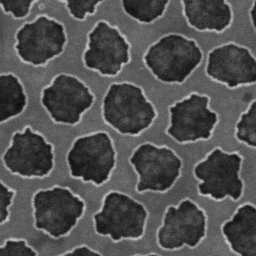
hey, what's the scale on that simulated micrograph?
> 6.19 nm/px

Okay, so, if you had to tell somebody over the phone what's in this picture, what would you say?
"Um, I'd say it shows a regular array of holes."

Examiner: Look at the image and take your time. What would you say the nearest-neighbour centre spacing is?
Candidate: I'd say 385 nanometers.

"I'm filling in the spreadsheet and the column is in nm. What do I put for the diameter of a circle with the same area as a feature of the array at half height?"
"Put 293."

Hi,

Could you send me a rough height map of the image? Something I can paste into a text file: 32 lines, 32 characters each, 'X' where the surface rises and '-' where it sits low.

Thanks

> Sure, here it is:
----XXXX----XXX------XX-----XXXX
X---XXXXX---XXXX----XXX------XX-
XXXX--XXXXXXXXXXX--XXXX------XXX
XXX-----XXXX--XXXXXXXXXX----XXXX
XX------XXX----XXXXXX--XXXXXXXXX
XX------XXX-----XXX-----XXXXXXXX
XX------XXX-----XX-------X-----X
XXX---XXXXX-----XX-------X------
XXXXXXXXXXX----XXXX-----XX------
--XXXXX--XXXXXXXXXX----XXX------
---XXX----XXXX--XXXXXXXXXXXX--XX
---XX------XX-----XXXXXXXXXXXXXX
---XX-------X-----XXXXX---XXXXXX
---XXX-----XX------XX-----XXXXX-
--XXXX----XXX------XX------XXX--
XXXXXXXXXXXXXX-----XX------XXX--
XXX-XXXXXXXXXXX--XXXX-----XXXX--
XX----XXXX----XXXXXXXX--XXXXXX--
X-----XXX-----XXX----XXXXXXXXXXX
X------X------XX------XXXX----XX
X------XX-----XXX------XX-----XX
XX----XXX-----XXX-----XX------XX
XXXXXXXXXX---XXXX-----XXX-----XX
-XXXXXX-XXXXXXXXX----XXXX-----XX
--XX-----XXXX---XXXXXXXXXX----XX
-XXX------XXX-----XXXXX-XXXXXXXX
-XXX------XX------XXX----XXXXX--
-XXX------XX------XXX-----XXX---
XXXXX----XXX------XX------XX----
XXXXXXXXXXXXXX----XX-----XXX----
X--XXXXXXXXXXXXXXXXX-----XXXX---
----XXXXX---XXXXXXXXXXXXXXXXX---